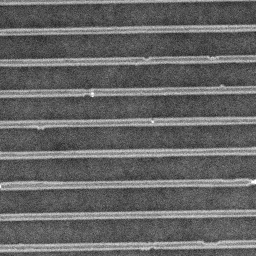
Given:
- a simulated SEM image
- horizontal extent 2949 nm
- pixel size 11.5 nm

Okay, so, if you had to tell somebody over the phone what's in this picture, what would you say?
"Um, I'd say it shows parallel lines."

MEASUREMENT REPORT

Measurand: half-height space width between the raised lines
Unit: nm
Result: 292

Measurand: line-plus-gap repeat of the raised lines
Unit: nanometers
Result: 356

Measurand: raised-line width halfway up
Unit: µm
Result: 0.0634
